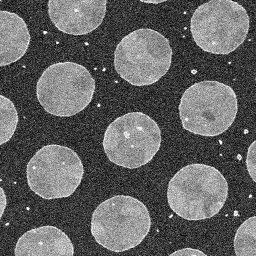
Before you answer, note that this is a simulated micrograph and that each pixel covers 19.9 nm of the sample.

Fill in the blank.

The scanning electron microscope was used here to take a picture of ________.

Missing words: raised bodies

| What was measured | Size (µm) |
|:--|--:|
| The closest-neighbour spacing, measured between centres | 1.65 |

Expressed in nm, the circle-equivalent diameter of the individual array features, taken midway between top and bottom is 1120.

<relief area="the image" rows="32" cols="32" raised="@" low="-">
------@@@@@@@-------------@@@@--
@-----@@@@@@@-----------@@@@@@@-
@@@----@@@@@@-----------@@@@@@@-
@@@----@@@@@------------@@@@@@@-
@@@@------------@@@@----@@@@@@@-
@@@@-----------@@@@@@----@@@@@--
@@@-----------@@@@@@@-----@@@---
@@------------@@@@@@@-----------
------@@@@@---@@@@@@@-----------
-----@@@@@@----@@@@@------------
-----@@@@@@@-----@@------@@@----
-----@@@@@@@-----------@@@@@@---
@----@@@@@@------------@@@@@@@--
@@----@@@@------------@@@@@@@@--
@@-------------@@@-----@@@@@@---
@@------------@@@@@----@@@@@@---
@@-----------@@@@@@@----@@@@----
@------------@@@@@@@------------
-----@@@-----@@@@@@@-----------@
----@@@@@@---@@@@@@------------@
----@@@@@@-----@@@-------------@
---@@@@@@@------------@@@@@----@
----@@@@@@-----------@@@@@@@----
----@@@@@------------@@@@@@@----
@----@@@-------------@@@@@@@----
@------------@@@@@---@@@@@@@----
------------@@@@@@----@@@@@-----
------------@@@@@@@------------@
-----@@----@@@@@@@@-----------@@
---@@@@@----@@@@@@-----------@@@
--@@@@@@@----@@@@------------@@@
--@@@@@@@-------------@@@----@@@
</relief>